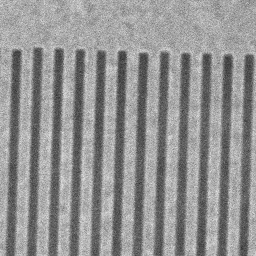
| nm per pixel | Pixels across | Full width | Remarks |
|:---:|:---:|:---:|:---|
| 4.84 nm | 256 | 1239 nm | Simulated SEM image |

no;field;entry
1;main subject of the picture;parallel lines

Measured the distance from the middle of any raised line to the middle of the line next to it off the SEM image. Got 0.102 micrometres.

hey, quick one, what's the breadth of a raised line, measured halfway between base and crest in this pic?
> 55.6 nm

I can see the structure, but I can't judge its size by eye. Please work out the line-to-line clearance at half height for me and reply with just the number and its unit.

47.1 nanometers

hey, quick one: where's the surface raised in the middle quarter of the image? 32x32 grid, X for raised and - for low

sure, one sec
XXX--XXX---XX---XX---XXX--XXX---
XXX--XXX---XX---XX---XXX--XXX---
XXX--XXX---XX---XX---XXX--XXX---
XXX--XXX---XX---XX---XXX--XXX---
XXX--XXX--XXX---XX---XXX--XXX---
XX---XXX--XXX---XX---XXX--XXX---
XX---XXX--XXX---XX---XXX--XXX--X
XX---XXX--XXX---XX---XX---XXX--X
XX---XXX--XXX--XXX---XX---XXX--X
XX---XXX--XXX--XXX---XX---XXX--X
XX---XXX--XXX--XXX---XX---XXX--X
XX---XXX--XXX--XXX---XX---XXX--X
XX---XXX--XXX--XXX---XX---XXX--X
XX---XXX--XXX---XX---XX---XXX--X
XX---XXX--XXX---XX---XX---XXX--X
XX---XXX--XXX--XXX---XX---XXX--X
XX---XX---XXX--XXX---XX---XXX--X
XX---XX---XXX--XXX---XX---XX---X
XX---XX---XXX--XXX--XXX---XX---X
XX---XX---XXX--XXX--XXX---XX---X
XX---XX---XXX--XXX--XXX---XX---X
XX---XX---XXX--XXX---XX---XX---X
XX---XX---XXX--XXX--XXX---XX---X
XX---XX---XXX--XXX--XXX---XX---X
XX---XX---XXX--XXX--XXX---XX---X
XX---XX---XXX--XXX--XXX---XX---X
XX---XX---XX---XXX--XXX---XX---X
XX--XXX---XX---XXX--XXX---XX---X
XX--XXX---XX---XXX--XXX--XXX---X
XX--XXX---XX---XXX--XXX--XXX---X
XX--XXX---XX---XXX--XXX--XXX---X
XX--XXX---XX---XX---XXX--XXX---X